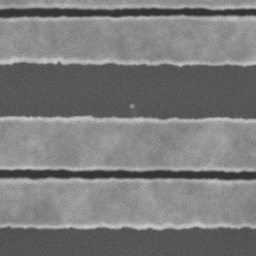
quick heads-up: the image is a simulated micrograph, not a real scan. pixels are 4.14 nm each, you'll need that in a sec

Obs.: lines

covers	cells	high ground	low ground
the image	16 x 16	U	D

UUUUUUUUUUUUUUUU
UUUUUUUUUUUUUUUU
UUUUUUUUUUUUUUUU
UUUUUUUUUUUUUUUU
DDDDDDDDDDDDDDDD
DDDDDDDDDDDDDDDD
DDDDDDDDDDDDDDDD
UUUUUUUUUUUUUUUU
UUUUUUUUUUUUUUUU
UUUUUUUUUUUUUUUU
UUUUUUUUUUUUUUUU
UUUUUUUUUUUUUUUU
UUUUUUUUUUUUUUUU
UUUUUUUUUUUUUUUU
DDDDDDDDDDDDDDDD
DDDDDDDDDDDDDDDD